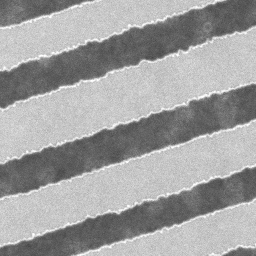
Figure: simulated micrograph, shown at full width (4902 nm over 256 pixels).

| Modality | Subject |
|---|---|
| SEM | one or a few lines or trenches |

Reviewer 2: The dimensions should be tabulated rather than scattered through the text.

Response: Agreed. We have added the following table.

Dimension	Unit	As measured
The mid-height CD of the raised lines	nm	712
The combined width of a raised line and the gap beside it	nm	1600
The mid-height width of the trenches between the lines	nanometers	826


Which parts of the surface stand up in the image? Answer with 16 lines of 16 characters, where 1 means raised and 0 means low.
1111000000001111
1000000001111111
0000001111111000
0001111111100000
1111111000000000
1111000000000001
1000000000011111
0000000011111111
0000011111111000
0011111111000000
1111111000000001
1110000000001111
0000000001111111
0000001111111000
0001111111000000
1111110000000001